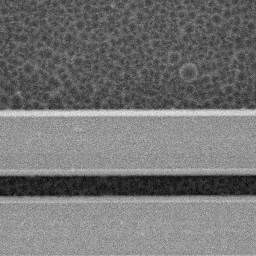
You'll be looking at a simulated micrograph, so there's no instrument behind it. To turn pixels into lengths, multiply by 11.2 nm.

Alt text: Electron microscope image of one or a few lines or trenches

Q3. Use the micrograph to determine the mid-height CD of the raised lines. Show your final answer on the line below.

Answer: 643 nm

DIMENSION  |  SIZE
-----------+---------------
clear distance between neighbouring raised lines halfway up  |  327 nm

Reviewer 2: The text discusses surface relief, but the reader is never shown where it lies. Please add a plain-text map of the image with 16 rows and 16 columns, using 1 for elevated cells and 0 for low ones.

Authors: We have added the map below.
0000000000000000
0000000000000000
0000000000000000
0000000000000000
0000000000000000
0000000000000000
0000000000000000
1111111111111111
1111111111111111
1111111111111111
1111111111111111
0000000000000000
0000000000011100
1111111111111111
1111111111111111
1111111111111111